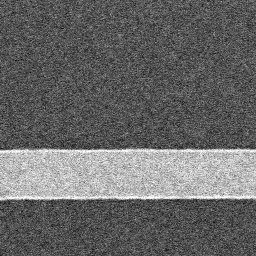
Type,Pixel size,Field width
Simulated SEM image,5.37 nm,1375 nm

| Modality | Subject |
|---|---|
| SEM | one or a few lines or trenches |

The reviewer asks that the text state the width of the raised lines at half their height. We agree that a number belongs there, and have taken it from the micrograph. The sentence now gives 258 nanometres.